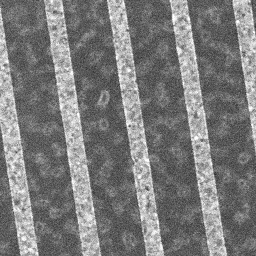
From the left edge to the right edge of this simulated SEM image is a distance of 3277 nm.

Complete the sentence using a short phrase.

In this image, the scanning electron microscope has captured one or a few lines or trenches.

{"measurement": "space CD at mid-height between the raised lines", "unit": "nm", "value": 588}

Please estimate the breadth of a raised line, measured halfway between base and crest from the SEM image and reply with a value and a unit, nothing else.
209 nanometres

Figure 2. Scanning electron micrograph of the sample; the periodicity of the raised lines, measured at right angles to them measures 786 nm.